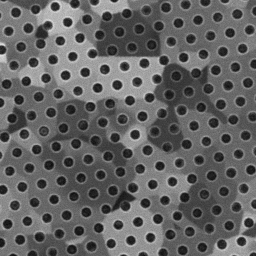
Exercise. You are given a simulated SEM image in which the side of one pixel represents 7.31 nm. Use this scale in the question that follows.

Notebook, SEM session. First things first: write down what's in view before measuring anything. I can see a regular array of holes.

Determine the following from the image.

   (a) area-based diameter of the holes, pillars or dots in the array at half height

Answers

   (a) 76 nm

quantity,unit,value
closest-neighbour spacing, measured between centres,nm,144